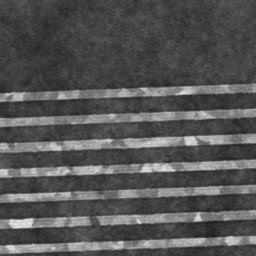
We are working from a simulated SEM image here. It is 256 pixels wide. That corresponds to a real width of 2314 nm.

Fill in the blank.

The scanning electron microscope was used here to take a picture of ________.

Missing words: parallel lines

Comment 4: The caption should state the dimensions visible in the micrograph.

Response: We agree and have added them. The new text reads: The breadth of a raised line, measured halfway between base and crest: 7.74 pixels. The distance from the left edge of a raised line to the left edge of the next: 229 nm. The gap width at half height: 157 nm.